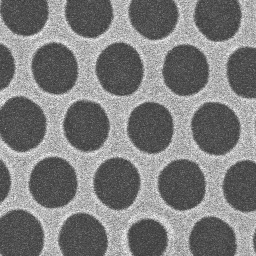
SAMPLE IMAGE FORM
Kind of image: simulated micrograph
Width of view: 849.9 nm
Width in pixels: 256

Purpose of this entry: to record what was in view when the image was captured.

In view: a regular array of holes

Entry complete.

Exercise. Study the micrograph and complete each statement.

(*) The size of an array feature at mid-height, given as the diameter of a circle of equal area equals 167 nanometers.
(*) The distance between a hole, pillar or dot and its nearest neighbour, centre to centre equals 216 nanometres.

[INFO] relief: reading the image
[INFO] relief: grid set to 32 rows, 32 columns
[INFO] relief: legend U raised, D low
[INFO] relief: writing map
DDDDDDUUDDDDDDUUDDDDDDUUDDDDDDUU
DDDDDDUUDDDDDDUUDDDDDDUUDDDDDDUU
DDDDDDUUDDDDDDUUDDDDDDUUDDDDDDUU
UDDDDUUUUDDDDDUUUDDDDDUUUDDDDDUU
UUDDUUUUUUDDUUUUUUDDDUUUUDDDDUUU
UUUUUUDDUUUUUUDDUUUUUUUDUUUUUUUU
DUUUDDDDDUUUUDDDDUUUUDDDDUUUUDDD
DDUUDDDDDDUUDDDDDDUUDDDDDDUUDDDD
DDUUDDDDDDUUDDDDDDUUDDDDDDUUDDDD
DDUUDDDDDDUUDDDDDDUUDDDDDDUUDDDD
DUUUUDDDDUUUUDDDDDUUUDDDDDUUUDDD
UUUUUUDDUUUUUDDDDUUUUUDDDUUUUDDD
UDDDUUUUUUDUUUUUUUUUUUUUUUUUUUUU
DDDDDUUUUDDDDUUUUDDDDUUUUDDDDUUU
DDDDDDUUDDDDDUUUDDDDDDUUDDDDDDUU
DDDDDDUUDDDDDDUUDDDDDDUUDDDDDDUU
DDDDDDUUDDDDDDUUDDDDDDUUDDDDDDUU
DDDDDUUUDDDDDUUUDDDDDUUUDDDDDDUU
UDDDUUUUUDDDUUUUUDDDDUUUUDDDDUUU
UUUUUUUUUUUUUUUUUUUUUUUUUUUDUUUU
DUUUUDDDDUUUUDDDDUUUUDDDDUUUUDDD
DUUUDDDDDUUUDDDDDUUUDDDDDUUUDDDD
DUUUDDDDDDUUDDDDDDUUDDDDDDUUDDDD
DUUUDDDDDDUUDDDDDUUUDDDDDDUUDDDD
DUUUDDDDDUUUDDDDDUUUDDDDDDUUDDDD
UUUUUDDDUUUUUDDDUUUUUDDDDUUUUDDD
UDDDUUUUUUUUUUUUUUUUUUUUUUUUUUDU
DDDDDUUUDDDDUUUUUDDUUUUUUDDDUUUU
DDDDDUUUDDDDDUUUDDDDDUUUDDDDDUUU
DDDDDDUDDDDDDUUUDDDDDUUUDDDDDUUU
DDDDDDUDDDDDDDUUDDDDDUUUDDDDDDUU
DDDDDUUUDDDDDUUUDDDDDUUUDDDDDDUU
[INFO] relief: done